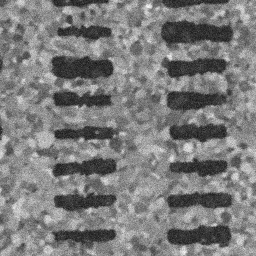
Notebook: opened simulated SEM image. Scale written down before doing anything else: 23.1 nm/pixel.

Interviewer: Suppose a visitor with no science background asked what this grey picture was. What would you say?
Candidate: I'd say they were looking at a regular array of holes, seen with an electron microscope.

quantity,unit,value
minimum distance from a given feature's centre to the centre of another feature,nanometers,772